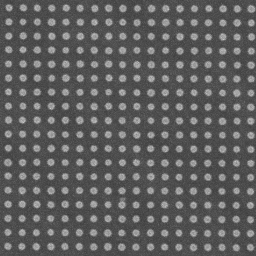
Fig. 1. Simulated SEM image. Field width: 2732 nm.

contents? a regular array of raised bodies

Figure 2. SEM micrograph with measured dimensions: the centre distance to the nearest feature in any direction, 0.148 micrometres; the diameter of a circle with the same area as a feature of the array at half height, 66 nanometres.